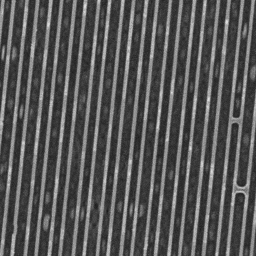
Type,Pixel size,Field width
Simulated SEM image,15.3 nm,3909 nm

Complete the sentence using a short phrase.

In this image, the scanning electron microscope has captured parallel lines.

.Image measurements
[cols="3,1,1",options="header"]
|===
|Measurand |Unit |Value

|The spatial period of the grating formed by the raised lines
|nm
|182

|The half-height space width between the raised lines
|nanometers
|129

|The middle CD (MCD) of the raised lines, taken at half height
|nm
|43.7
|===